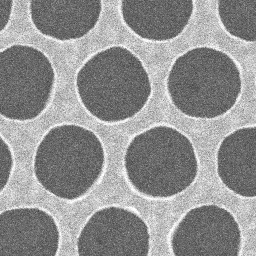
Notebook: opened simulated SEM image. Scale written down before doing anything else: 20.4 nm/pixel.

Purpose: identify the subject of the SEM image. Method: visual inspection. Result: holes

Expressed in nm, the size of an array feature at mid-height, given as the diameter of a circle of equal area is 1480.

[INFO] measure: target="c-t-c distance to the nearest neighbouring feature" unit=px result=89.4